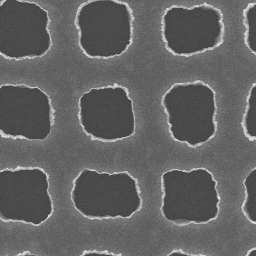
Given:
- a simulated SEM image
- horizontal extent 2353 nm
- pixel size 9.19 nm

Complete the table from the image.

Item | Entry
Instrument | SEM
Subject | holes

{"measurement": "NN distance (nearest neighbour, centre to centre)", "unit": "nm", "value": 768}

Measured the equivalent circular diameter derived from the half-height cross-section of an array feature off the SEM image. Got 508 nanometers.